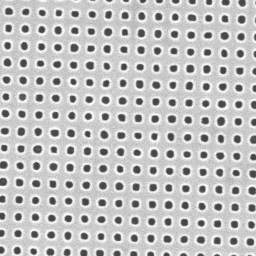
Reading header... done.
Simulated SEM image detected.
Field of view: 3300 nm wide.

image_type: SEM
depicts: a regular array of holes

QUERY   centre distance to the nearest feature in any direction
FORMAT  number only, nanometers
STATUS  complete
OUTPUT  212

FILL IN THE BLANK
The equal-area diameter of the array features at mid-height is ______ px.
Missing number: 8.29